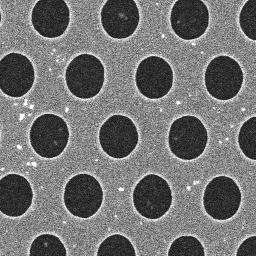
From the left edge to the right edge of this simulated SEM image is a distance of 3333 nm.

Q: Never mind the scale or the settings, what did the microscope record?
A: a regular array of holes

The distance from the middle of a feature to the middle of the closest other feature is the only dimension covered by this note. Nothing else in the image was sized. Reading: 0.896 µm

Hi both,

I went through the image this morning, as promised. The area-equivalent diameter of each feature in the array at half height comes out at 542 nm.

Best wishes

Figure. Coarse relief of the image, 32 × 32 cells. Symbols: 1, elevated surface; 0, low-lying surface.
11110000111110000111110000111110
11110000011110000111100000111100
11110000011110000111100000111100
11110000111110000111110000111100
11111001111111001111110001111110
11111111111111111111111111111111
11111111111111111111111111111111
00001111100011111100011111100111
00001111000001111000011111000011
00001111000001111000001111000011
00001111000001111000011111000011
00011111100011111000011111000011
11111111111111111111111111111111
11111111111111111111111111111111
11111001111111001111111011111111
11110000111110000111110001111100
11110000011100000111100000111100
11110000111100000111100000111100
11110000111110000111100000111100
11111001111111001111110001111110
11111111111111111111111111111111
11111111111111111111111111111111
00011111100011111100011111000111
00001111000001111000011111000011
00001111000001111000011110000011
00001111000001111000011110000011
00011111100011111000011111000011
11111111111111111111111111111111
11111111111111111111111111111111
11111001111111011111111011111111
11110000111110001111100001111100
11110000111100000111100000111100